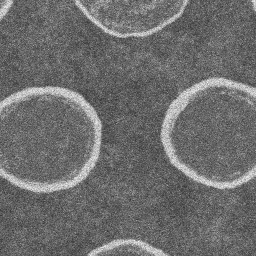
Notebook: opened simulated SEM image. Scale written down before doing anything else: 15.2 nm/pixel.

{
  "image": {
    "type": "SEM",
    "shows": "raised bodies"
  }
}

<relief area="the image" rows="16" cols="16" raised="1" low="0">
0000011111100000
0000001111000000
0000000000000000
0000000000000000
0000000000000000
0000000000001110
1111100000011111
1111110000111111
1111110000111111
1111110000011111
1111100000011111
0111000000000100
0000000000000000
0000000000000000
0000000000000000
0000000110000000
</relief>